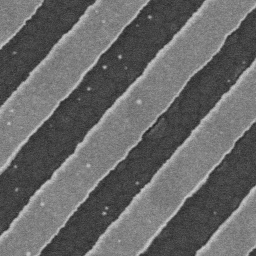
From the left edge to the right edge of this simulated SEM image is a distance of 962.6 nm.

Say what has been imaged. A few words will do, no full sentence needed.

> lines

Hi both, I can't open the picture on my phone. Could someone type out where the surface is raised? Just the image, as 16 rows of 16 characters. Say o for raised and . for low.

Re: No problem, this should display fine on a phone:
oo....ooo....ooo
oo...ooo....ooo.
o...ooo....ooo..
...ooo....ooo...
..ooo....ooo...o
.oooo...ooo....o
oooo...oooo...oo
ooo...oooo...ooo
oo...oooo...ooo.
o....ooo...ooo..
....ooo...ooo...
...ooo...oooo...
..ooo...oooo...o
.ooo....ooo...oo
oooo...ooo....oo
ooo...ooo....ooo